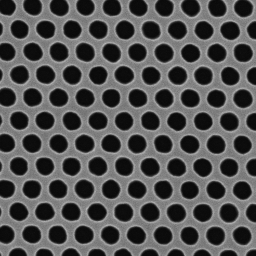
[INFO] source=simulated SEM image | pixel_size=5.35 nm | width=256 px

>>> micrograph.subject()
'a regular array of holes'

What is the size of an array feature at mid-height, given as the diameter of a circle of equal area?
96.2 nanometres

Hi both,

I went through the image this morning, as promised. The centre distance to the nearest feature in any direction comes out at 139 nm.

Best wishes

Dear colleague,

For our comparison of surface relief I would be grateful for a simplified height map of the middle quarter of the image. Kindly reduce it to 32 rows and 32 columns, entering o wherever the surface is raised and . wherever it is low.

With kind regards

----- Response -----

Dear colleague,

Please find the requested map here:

oooooooooooooo.ooooooooooooooooo
....ooo...ooo....ooo...oooo...oo
....oo.....oo....oo.....oo.....o
....oo.....oo....ooo....oo.....o
o...ooo...oooo..oooo...oooo...oo
oooooooooooooooooooooooooooooooo
oooo..ooooo..oooo..oooooo.ooooo.
.oo....ooo....oo....ooo....oo...
.oo.....o.....oo.....oo....oo...
.oo....ooo....oo.....oo....oo...
ooooo.ooooo..oooo..ooooo..oooo..
oooooooooooooooooooooooooooooooo
...oooo...oooo..oooo...oooo..ooo
....oo.....oo....oo.....oo....oo
....oo.....oo....oo.....oo.....o
....ooo....oo....ooo....oo....oo
oo.oooooooooooooooooo..ooooo.ooo
oooooooooooooooooooooooooooooooo
ooo....ooo...ooo....ooo...oooo..
.oo....oo.....oo.....o.....oo...
.oo....oo.....oo....ooo....oo...
oooo...ooo....ooo...ooo....ooo..
oooooooooooooooooooooooooooooooo
o.oooooo.ooooooooooooooooooooooo
....oo....ooo....ooo...ooo....oo
....oo.....oo....oo.....oo....oo
....oo.....oo....oo.....oo....oo
o..ooooo..oooo...ooo...oooo...oo
oooooooooooooooooooooooooooooooo
ooo....ooo...oooo..ooooo..ooooo.
.oo....ooo....oo....ooo....oo...
.oo.....oo....oo.....oo....oo...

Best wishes